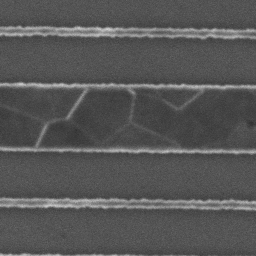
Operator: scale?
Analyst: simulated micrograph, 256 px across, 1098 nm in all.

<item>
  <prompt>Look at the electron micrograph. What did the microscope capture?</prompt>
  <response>lines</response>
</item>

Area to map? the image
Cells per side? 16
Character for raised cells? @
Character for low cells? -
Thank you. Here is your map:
----------------
----------------
----------------
----------------
----------------
@@@@@@@@@@@@@@@@
@@@@@@@@@@@@@@@@
@@@@@@@@@@@@@@@@
@@@@@@@@@@@@@@@@
--------@@@@@@@@
----------------
----------------
--@-------------
----------------
----------------
----------------